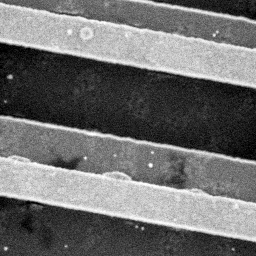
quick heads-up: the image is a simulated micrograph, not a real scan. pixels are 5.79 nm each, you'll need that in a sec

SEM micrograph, lines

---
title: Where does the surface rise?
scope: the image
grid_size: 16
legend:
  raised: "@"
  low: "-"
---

@@@@@@@@@@@-----
@@@@@@@@@@@@@@@@
@@@@@@@@@@@@@@@@
-----@@@@@@@@@@@
-----------@@@@@
----------------
----------------
@@--------------
@@@@@@@---------
@@@@@@@@@@@@@---
@@@@@@@@@@@@@@@@
@@@@@@@@@@@@@@@@
--@@@@@@@@@@@@@@
-------@@@@@@@@@
-------------@@@
----------------